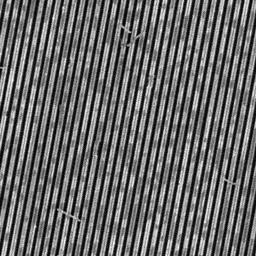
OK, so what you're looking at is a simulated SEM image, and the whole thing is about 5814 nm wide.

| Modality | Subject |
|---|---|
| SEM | parallel lines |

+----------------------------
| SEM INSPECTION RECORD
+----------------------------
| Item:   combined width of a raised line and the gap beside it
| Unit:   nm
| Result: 183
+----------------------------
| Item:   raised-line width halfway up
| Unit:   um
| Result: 0.081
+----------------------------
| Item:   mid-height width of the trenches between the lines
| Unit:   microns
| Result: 0.0978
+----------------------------